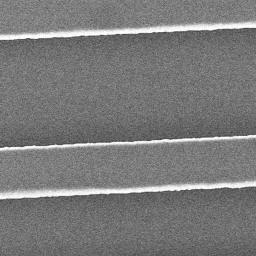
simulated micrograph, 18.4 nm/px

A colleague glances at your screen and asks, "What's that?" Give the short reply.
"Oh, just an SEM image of lines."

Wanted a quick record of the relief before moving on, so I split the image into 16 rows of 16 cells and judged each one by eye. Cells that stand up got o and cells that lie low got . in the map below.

oooooooooooooooo
oooooooooooooooo
................
................
................
................
................
................
...............o
oooooooooooooooo
oooooooooooooooo
oooooooooooooooo
................
................
................
................